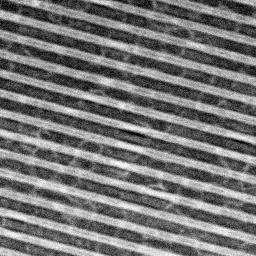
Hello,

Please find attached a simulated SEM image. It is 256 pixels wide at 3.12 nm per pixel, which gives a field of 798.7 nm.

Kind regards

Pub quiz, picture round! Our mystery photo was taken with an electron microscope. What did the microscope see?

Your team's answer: parallel lines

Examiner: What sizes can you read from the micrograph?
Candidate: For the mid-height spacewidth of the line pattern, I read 39.6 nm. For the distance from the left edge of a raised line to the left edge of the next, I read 59.6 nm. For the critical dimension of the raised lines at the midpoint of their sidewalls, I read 18.5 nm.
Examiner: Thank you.